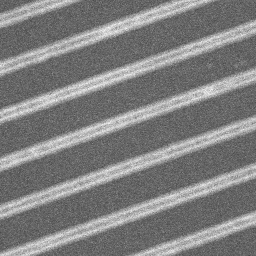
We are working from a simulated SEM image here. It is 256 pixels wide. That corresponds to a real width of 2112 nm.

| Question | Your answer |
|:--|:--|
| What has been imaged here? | parallel lines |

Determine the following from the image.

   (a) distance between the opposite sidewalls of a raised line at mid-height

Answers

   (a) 84.7 nanometres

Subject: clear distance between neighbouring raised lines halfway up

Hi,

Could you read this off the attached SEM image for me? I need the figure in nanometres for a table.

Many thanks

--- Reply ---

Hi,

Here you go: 286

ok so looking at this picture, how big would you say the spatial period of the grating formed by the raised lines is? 372 nm